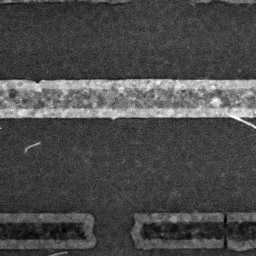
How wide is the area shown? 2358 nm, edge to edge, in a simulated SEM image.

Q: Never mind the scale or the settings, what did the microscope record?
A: one or a few lines or trenches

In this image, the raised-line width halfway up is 0.28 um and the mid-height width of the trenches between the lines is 0.946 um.